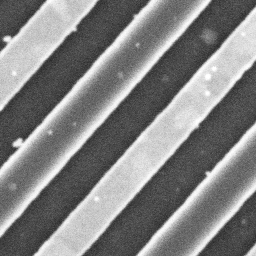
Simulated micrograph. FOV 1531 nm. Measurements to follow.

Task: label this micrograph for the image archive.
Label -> lines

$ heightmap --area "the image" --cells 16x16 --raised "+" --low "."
...+++...++++...
..+++...++++...+
.+++...++++...++
+++...++++...+++
++...++++...+++.
+....+++...+++..
....+++....+++..
...+++....+++...
..++++...+++...+
.++++...+++...++
++++...+++...+++
+++...+++....+++
++...+++....+++.
+...+++....+++..
...+++....++++..
...+++...++++...